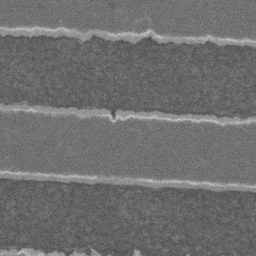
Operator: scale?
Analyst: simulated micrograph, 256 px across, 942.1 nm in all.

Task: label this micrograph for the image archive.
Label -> one or a few lines or trenches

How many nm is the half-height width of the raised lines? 251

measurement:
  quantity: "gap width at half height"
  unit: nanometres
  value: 280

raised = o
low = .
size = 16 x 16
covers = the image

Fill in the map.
oooooooooooooooo
oooooooooooooooo
...........ooooo
................
................
................
................
oooooooooooooo.o
oooooooooooooooo
oooooooooooooooo
oooooooooooooooo
..........oooooo
................
................
................
................